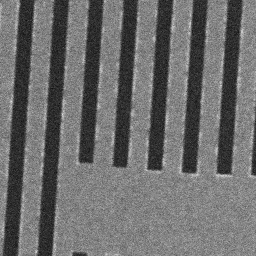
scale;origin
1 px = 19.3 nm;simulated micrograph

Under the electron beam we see parallel lines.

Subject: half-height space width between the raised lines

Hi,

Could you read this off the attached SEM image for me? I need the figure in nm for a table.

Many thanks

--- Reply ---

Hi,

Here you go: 300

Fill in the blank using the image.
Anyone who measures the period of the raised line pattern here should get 0.667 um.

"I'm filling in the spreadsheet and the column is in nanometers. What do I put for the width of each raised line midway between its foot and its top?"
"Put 365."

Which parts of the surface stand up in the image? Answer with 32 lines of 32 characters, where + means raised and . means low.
++..+++..++..++..+++..++..++..++
++..+++..++..++..+++..++..++..++
++..+++..++..++..+++..++..++..++
++..++..+++..++..++..+++..++..++
++..++..+++..++..++..+++..++..++
++..++..+++..++..++..+++..++..++
++..++..+++..++..++..+++..++..++
++..++..+++..++..++..+++..++..++
++..++..+++..++..++..++..+++..++
++..++..++..+++..++..++..+++..++
++..++..++..+++..++..++..+++..++
++..++..++..+++..++..++..+++..++
++..++..++..+++..++..++..+++..++
+...++..++..+++.+++..++..+++..++
+..+++..++..++..+++..++..++..+++
+..+++..++..++..+++..++..++..+++
+..+++..++..++..+++..++..++..+++
+..+++..++..++..+++..++..++..+++
+..++..+++..++..++...++..++..+++
+..++..+++..++..++..+++..++..++.
+..++..+++++++..++..+++..++..++.
+..++..++++++++++++++++.+++..++.
+..++..+++++++++++++++++++++++++
+..++..+++++++++++++++++++++++++
+..++..+++++++++++++++++++++++++
+..++..+++++++++++++++++++++++++
+..++..+++++++++++++++++++++++++
+..++..+++++++++++++++++++++++++
+..++..+++++++++++++++++++++++++
..+++..+++++++++++++++++++++++++
..+++..+++++++++++++++++++++++++
..+++..++.++++++++++++++++++++++